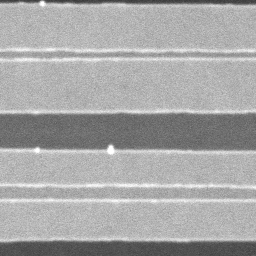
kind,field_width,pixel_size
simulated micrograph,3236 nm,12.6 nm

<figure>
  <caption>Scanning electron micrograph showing lines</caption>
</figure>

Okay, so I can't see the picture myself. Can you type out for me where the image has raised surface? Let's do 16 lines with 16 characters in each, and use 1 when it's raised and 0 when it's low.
1111111111111111
1111111111111111
1111111111111111
1111111111111111
1111111111111111
1111111111111111
1111111111111111
0000000000000000
0000000000000000
1111111111110000
1111111111111111
1111111111111111
1111111111111111
1111111111111111
1111111111111111
0000000000000000